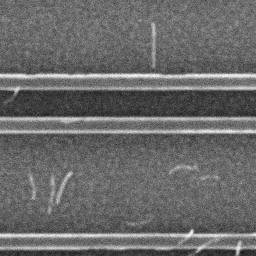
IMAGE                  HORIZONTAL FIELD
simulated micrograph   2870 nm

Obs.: lines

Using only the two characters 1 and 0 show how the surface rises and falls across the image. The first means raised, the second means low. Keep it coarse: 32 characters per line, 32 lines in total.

00000000000000000000000000000000
00000000000000000000000000000000
00000000000000000000000000000000
00000000000000000000000000000000
00000000000000000000000000000000
00000000000000000000000000000000
00000000000000000000000000000000
00000000000000000000000000000000
00000000000000000000000000000000
11111111111111111111111111111111
11111111111111111111111111111111
00000000000000000000000000000000
00000000000000000000000000000000
00000000000000000000000000000000
00000000000000000000000000000000
11111111111111111111111111111111
11111111111111111111111111111111
00000000000000000000000000000000
00000000000000000000000000000000
00000000000000000000000000000000
00000000000000000000000000000000
00000000000000000000000000000000
00000000000000000000000000000000
00000000000000000000000000000000
00000000000000000000000000000000
00000000000000000000000000000000
00000000000000000000000000000000
00000000000000000000000000000000
00000000000000000000000000000000
11111111111111111111111111111111
11111111111111111111111111111111
00000000000000000000000000000000